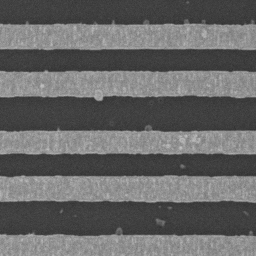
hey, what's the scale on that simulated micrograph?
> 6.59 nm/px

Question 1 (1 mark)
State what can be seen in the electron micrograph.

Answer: lines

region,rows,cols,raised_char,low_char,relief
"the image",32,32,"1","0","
00000000000000000000000000000000
00000000000000000000000000000000
00000000000000000000000000000000
11111111111111111111111111111111
11111111111111111111111111111111
11111111111111111111111111111111
00000000000000000000000000000000
00000000000000000000000000000000
00000000000000000000000000000000
11111111111111111111111111111111
11111111111111111111111111111111
11111111111111111111111111111111
00000000000010000000000000000000
00000000000000000000000000000000
00000000000000000000000000000000
00000000000000000000000000000000
10111111111111111111000011111111
11111111111111111111111111111111
11111111111111111111111111111111
00000000000000000000000000000000
00000000000000000000000000000000
00000000000000000000000000000000
11111111111111111111111111111111
11111111111111111111111111111111
11111111111111111111111111111111
00000000000000000000000000000000
00000000000000000000000000000000
00000000000000000000000000000000
00000000000000000000000000000000
11111111110011111111111111110010
11111111111111111111111111111111
11111111111111111111111111111111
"